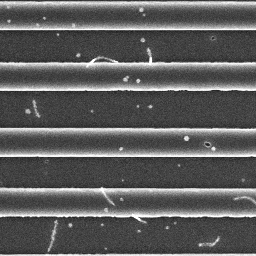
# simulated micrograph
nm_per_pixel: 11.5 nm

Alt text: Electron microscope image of lines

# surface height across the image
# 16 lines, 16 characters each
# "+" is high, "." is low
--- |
++++++++++++++++
++++++++++++++++
................
................
++++++++++++++++
++++++++++++++++
................
................
++++++++++++++++
++++++++++++++++
................
................
++++++++++++++++
.++++.++++++++++
................
................